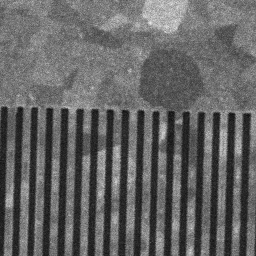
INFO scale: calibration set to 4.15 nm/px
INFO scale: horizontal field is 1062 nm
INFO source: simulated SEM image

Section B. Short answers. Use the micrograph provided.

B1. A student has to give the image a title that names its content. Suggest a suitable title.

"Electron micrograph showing parallel lines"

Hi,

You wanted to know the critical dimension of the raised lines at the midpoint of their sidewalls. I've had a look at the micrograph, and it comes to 30.6 nanometres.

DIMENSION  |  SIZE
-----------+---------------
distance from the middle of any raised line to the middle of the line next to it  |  63 nm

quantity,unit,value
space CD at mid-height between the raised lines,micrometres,0.0348